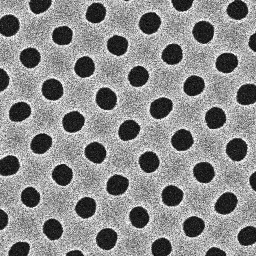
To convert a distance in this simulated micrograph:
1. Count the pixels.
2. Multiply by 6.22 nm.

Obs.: a regular array of holes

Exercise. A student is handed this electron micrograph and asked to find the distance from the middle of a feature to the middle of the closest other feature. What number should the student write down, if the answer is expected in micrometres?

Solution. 0.238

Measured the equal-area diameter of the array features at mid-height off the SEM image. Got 133 nm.